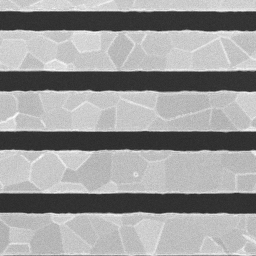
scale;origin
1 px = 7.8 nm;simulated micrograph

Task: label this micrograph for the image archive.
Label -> lines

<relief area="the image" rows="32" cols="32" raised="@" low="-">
@@@@@@@@@@@@@@@@@@@@@@@@@@@@@@@@
--------------------------------
--------------------------------
--------------------------------
@@@@@@@@@@@@@@@@@@@@@@@@@@@@@@@@
@@@@@@@@@@@@@@@@@@@@@@@@@@@@@@@@
@@@@@@@@@@@@@@@@@@@@@@@@@@@@@@@@
@@@@@@@@@@@@@@@@@@@@@@@@@@@@@@@@
@@@@@@@@@@@@@@@@@@@@@@@@@@@@@@@@
--------------------------------
--------------------------------
-@@@@@@@@@@@@@@-@-@@--@@@--@@@--
@@@@@@@@@@@@@@@@@@@@@@@@@@@@@@@@
@@@@@@@@@@@@@@@@@@@@@@@@@@@@@@@@
@@@@@@@@@@@@@@@@@@@@@@@@@@@@@@@@
@@@@@@@@@@@@@@@@@@@@@@@@@@@@@@@@
--------------------------------
--------------------------------
--------------------------------
@@@@@@@@@@@@@@@@@@@@@@@@@@@@@@@@
@@@@@@@@@@@@@@@@@@@@@@@@@@@@@@@@
@@@@@@@@@@@@@@@@@@@@@@@@@@@@@@@@
@@@@@@@@@@@@@@@@@@@@@@@@@@@@@@@@
@@@@@@@@@@@@@@@@@@@@@@@@@@@@@@@@
--------------------------------
--------------------------------
--------------------------------
@@@@@@@@@@@@@@@@@@@@@@@@@@@@@@@@
@@@@@@@@@@@@@@@@@@@@@@@@@@@@@@@@
@@@@@@@@@@@@@@@@@@@@@@@@@@@@@@@@
@@@@@@@@@@@@@@@@@@@@@@@@@@@@@@@@
@@@@@@@@@@@@@@@@@@@@@@@@@@@@@@@@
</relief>